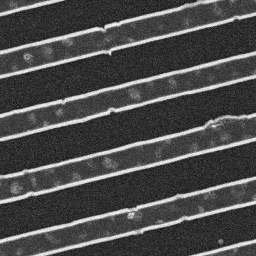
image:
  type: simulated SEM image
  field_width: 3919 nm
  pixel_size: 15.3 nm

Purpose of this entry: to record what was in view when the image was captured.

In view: one or a few lines or trenches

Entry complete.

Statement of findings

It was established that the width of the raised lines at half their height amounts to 364 nanometres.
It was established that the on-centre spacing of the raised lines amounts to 0.933 µm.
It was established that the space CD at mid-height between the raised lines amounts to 567 nm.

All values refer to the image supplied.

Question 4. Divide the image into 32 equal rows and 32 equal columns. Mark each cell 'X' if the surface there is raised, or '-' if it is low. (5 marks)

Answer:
XXXXXX------------------XXXXXXXX
X--------------------XXXXXXXXXXX
----------------XXXXXXXXXXXXX---
-------------XXXXXXXXXXXX-------
---------XXXXXXXXXXXX-----------
----XXXXXXXXXXXXX---------------
XXXXXXXXXXXXXX------------------
XXXXXXXXX-------------------XXXX
XXXXX-------------------XXXXXXXX
X-------------------XXXXXXXXXXXX
----------------XXXXXXXXXXXX----
------------XXXXXXXXXXXX--------
--------XXXXXXXXXXXX------------
----XXXXXXXXXXXX----------------
XXXXXXXXXXXX-------------------X
XXXXXXXX------------------XXXXXX
XXXX-------------------XXXXXXXXX
-------------------XXXXXXXXXXXXX
---------------XXXXXXXXXXXXX----
-----------XXXXXXXXXXXX---------
--------XXXXXXXXXXXX------------
---XXXXXXXXXXXX-----------------
XXXXXXXXXXX--------------------X
XXXXXXX--------------------XXXXX
XXX--------------------XXXXXXXXX
-------------------XXXXXXXXXXXX-
---------------XXXXXXXXXXXX-----
-----------XXXXXXXXXXXX---------
-------XXXXXXXXXXXX-------------
--XXXXXXXXXXXXX-----------------
XXXXXXXXXXX-------------------XX
XXXXXXX-------------------XXXXXX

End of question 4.